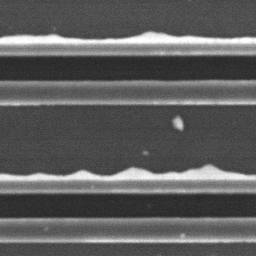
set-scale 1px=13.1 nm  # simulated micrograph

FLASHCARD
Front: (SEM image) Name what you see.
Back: lines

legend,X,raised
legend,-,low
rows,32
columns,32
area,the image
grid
--------------------------------
--------------------------------
--------------------------------
--------------------------------
--------------------------------
XXXXXXXXXXXXXXXXXXXXXXXXXXXXXXXX
XXXXXXXXXXXXXXXXXXXXXXXXXXXXXXXX
--------------------------------
--------------------------------
--------------------------------
XXXXXXXXXXXXXXXXXXXXXXXXXXXXXXXX
XXXXXXXXXXXXXXXXXXXXXXXXXXXXXXXX
XXXXXXXXXXXXXXXXXXXXXXXXXXXXXXXX
--------------------------------
--------------------------------
--------------------------------
--------------------------------
--------------------------------
--------------------------------
--------------------------------
--------------------------------
--------------------------------
XXXXXXXXXXXXXXXXXXXXXXXXXXXXXXXX
XXXXXXXXXXXXXXXXXXXXXXXXXXXXXXXX
--------------------------------
--------------------------------
--------------------------------
XXXXXXXXXXXXXXXXXXXXXXXXXXXXXXXX
XXXXXXXXXXXXXXXXXXXXXXXXXXXXXXXX
XXXXXXXXXXXXXXXXXXXXXXXXXXXXXXXX
--------------------------------
--------------------------------